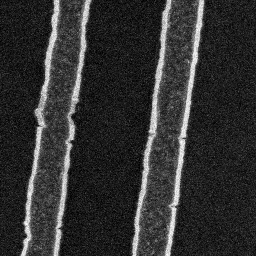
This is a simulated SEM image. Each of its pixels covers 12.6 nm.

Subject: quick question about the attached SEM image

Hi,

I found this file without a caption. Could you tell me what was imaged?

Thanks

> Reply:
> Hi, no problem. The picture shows one or a few lines or trenches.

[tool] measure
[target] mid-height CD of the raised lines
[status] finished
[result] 428 nm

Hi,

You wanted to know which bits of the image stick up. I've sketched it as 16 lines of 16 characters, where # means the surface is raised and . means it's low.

...##.....###...
...##.....##....
...##.....##....
...##.....##....
...##.....##....
...##.....##....
...##.....##....
..##......##....
..##.....##.....
..##.....##.....
..##.....##.....
..##.....##.....
..##.....##.....
..##.....##.....
..##.....##.....
..##....###.....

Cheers